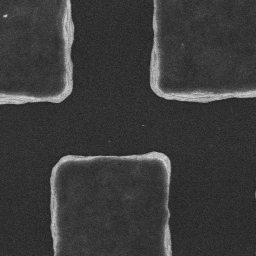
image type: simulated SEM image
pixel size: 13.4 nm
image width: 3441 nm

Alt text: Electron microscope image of raised bodies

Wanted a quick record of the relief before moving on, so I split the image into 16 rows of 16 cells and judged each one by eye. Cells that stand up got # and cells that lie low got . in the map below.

####......######
####......######
####......######
####......######
####......######
####......######
................
................
................
................
....#######.....
...########.....
...########.....
...########.....
...#######......
...#######......